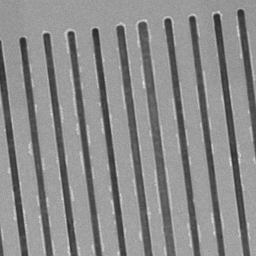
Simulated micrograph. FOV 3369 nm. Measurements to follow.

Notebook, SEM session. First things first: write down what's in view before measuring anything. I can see parallel lines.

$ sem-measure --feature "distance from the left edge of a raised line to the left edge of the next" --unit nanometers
322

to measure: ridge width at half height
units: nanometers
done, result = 230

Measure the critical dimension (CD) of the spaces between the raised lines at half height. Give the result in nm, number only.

96.3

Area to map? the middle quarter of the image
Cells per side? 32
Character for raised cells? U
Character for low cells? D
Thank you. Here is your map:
UUDDUUUUDDUUUUDDUUUUDDUUUUDDUUUU
UUDDUUUUDDUUUUDDDUUUDDUUUUUDDUUU
UUDDUUUUDDUUUUDDDUUUDDUUUUUDDUUU
UUDDUUUUDDUUUUUDDUUUDDDUUUUDDUUU
UUDDUUUUUDUUUUUDDUUUDDDUUUUDDUUU
UUDDUUUUUDDUUUUDDUUUDDDUUUUDDUUU
UUUDDUUUUDDUUUUDDUUUDDDUUUUDDUUU
UUUDDUUUUDDUUUUDDUUUUDDUUUUDDUUU
UUUDDUUUUDDUUUUDDUUUUDDUUUUDDUUU
UUUDDUUUUDDUUUUDDDUUUDDUUUUUDUUU
UUUDDUUUUDDUUUUDDDUUUDDUUUUUDDUU
UUUDDUUUUDDUUUUUDDUUUDDDUUUUDDUU
UUUDDUUUUUDUUUUUDDUUUDDDUUUUDDUU
UUUDDUUUUUDDUUUUDDUUUDDDUUUUDDUU
UUUUDDUUUUDDUUUUDDUUUDDDUUUUDDUU
UUUUDDUUUUDDUUUUDDUUUDDDUUUUDDUU
UUUUDDUUUUDDUUUUDDUUUUDDUUUUDDUU
UUUUDDUUUUDDUUUUDDDUUUDDUUUUUDDU
UUUUDDUUUUDDUUUUDDDUUUDDUUUUUDDU
UUUUDDUUUUDDUUUUUDDUUUDDDUUUUDDU
UUUUDDUUUUUDUUUUUDDUUUDDDUUUUDDU
UUUUDDUUUUUDDUUUUDDUUUDDDUUUUDDU
UUUUUDUUUUUDDUUUUDDUUUDDDUUUUDDU
UUUUUDDUUUUDDUUUUDDUUUUDDUUUUDDU
DUUUUDDUUUUDDUUUUDDUUUUDDUUUUDDU
DUUUUDDUUUUDDUUUUDDDUUUDDUUUUUDU
DUUUUDDUUUUDDUUUUDDDUUUDDUUUUUDD
DUUUUDDUUUUDDUUUUUDDUUUDDDUUUUDD
DUUUUDDUUUUUDUUUUUDDUUUDDDUUUUDD
DUUUUDDUUUUUDDUUUUDDUUUDDDUUUUDD
DUUUUUDDUUUUDDUUUUDDUUUDDDUUUUDD
DUUUUUDDUUUUDDUUUUDDUUUUDDUUUUDD